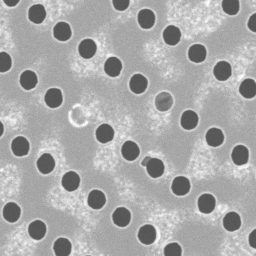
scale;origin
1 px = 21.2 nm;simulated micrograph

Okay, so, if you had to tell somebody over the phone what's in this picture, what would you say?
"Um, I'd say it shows a regular array of holes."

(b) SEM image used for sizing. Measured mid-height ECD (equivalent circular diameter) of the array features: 416 nanometres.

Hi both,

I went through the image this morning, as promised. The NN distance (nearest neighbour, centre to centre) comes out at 30.7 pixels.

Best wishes